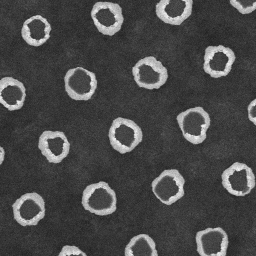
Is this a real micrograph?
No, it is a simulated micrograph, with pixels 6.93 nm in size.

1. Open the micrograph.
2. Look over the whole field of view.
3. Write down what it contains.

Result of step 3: a regular array of raised bodies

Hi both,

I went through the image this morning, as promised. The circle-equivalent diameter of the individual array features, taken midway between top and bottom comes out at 204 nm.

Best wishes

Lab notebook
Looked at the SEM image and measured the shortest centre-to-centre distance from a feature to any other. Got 474 nanometres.